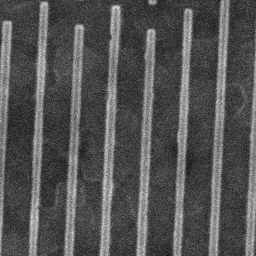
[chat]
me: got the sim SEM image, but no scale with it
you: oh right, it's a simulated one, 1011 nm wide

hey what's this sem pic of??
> parallel lines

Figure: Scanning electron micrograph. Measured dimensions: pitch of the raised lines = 143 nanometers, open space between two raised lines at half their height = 114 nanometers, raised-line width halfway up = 31.1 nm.